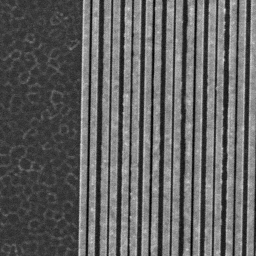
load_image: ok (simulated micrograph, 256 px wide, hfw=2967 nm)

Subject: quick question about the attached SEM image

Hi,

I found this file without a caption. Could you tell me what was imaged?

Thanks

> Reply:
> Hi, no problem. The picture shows parallel lines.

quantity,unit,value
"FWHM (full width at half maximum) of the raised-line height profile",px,6.5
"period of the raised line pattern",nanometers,121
